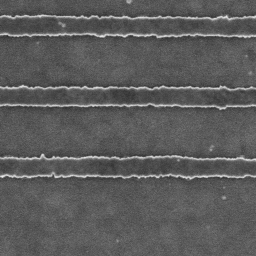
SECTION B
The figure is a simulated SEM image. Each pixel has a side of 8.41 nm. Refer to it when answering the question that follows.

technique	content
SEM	one or a few lines or trenches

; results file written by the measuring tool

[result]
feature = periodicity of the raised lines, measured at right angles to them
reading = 0.593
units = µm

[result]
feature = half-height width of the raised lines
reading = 158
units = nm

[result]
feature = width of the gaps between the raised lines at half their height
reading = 438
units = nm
